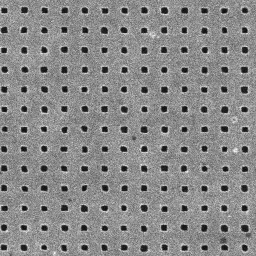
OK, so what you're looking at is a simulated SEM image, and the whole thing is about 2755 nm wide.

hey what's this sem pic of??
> a regular array of holes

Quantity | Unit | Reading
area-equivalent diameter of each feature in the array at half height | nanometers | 71.8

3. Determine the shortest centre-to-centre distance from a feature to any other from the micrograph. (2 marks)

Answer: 209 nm